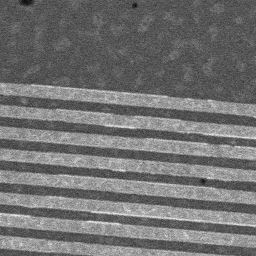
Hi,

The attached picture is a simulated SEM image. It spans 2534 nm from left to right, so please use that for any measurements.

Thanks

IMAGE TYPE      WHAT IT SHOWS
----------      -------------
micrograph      parallel lines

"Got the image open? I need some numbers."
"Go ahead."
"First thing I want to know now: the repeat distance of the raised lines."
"21.8 pixels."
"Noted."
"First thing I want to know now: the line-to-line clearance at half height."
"101 nm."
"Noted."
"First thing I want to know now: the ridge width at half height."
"11.1 px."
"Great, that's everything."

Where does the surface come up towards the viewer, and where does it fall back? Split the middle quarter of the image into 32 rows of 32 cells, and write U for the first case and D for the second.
DDDDDDDDDDDDDDDDDDDDDDDDDDDDDDDD
DDDDDDDDDDDDDDDDDDDDDDDDDDDDDDDD
DDDDDDDDDDDDDDDDDDDDDDDDDDDDDDDD
DDDDDDDDDDDDDDDDDDDDDDDDDDDDDDDD
DDDDDDDDDDDDDDDDDDDDDDDDDDDDDDDD
DDDDDDDDDDDDDDDDDDDDDDDDDDDDDDDD
UUUUDDDDDDDDDDDDDDDDDDDDDDDDDDDD
UUUUUUUUUUUUUUUUDDDDDDDDDDDDDDDD
UUUUUUUUUUUUUUUUUUUUUUUUUUUDDDDD
DDDDDDDDDUUUUUUUUUUUUUUUUUUUUUUU
DDDDDDDDDDDDDDDDDDDDUUUUUUUUUUUU
DDDDDDDDDDDDDDDDDDDDDDDDDDDDDDDD
UUUUUUUUUDDDDDDDDDDDDDDDDDDDDDDD
UUUUUUUUUUUUUUUUUUUUDDDDDDDDDDDD
DDUUUUUUUUUUUUUUUUUUUUUUUUUUUUUU
DDDDDDDDDDDDDUUUUUUUUUUUUUUUUUUU
DDDDDDDDDDDDDDDDDDDDDDDDDUUUUUUU
UUUUUDDDDDDDDDDDDDDDDDDDDDDDDDDD
UUUUUUUUUUUUUUUUDDDDDDDDDDDDDDDD
UUUUUUUUUUUUUUUUUUUUUUUUUUUUDDDD
DDDDDDDDDUUUUUUUUUUUUUUUUUUUUUUU
DDDDDDDDDDDDDDDDDDDDDUUUUUUUUUUU
DDDDDDDDDDDDDDDDDDDDDDDDDDDDDDDD
UUUUUUUUUUDDDDDDDDDDDDDDDDDDDDDD
UUUUUUUUUUUUUUUUUUUUUDDDDDDDDDDD
DDDUUUUUUUUUUUUUUUUUUUUUUUUUUUUU
DDDDDDDDDDDDUDUUUUUUUUUUUUUUUUUU
DDDDDDDDDDDDDDDDDDDDDDDDDDUUUUUU
UUUUUDDDDDDDDDDDDDDDDDDDDDDDDDDD
UUUUUUUUUUUUUUUUUDDDDDDDDDDDDDDD
UUUUUUUUUUUUUUUUUUUUUUUUUUUUUDDD
DDDDDDDDDDUUUUUUUUUUUUUUUUUUUUUU